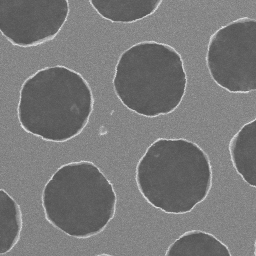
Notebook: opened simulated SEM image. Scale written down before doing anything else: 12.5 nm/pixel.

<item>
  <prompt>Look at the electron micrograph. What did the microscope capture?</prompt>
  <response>holes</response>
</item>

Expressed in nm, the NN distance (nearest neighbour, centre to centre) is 1230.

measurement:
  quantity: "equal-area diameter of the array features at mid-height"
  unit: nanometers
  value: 898